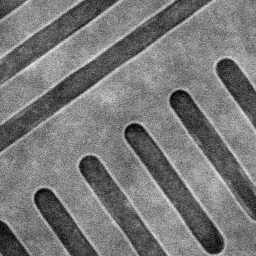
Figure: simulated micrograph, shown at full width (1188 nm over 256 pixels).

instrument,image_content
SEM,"groups of lines, slits or small figures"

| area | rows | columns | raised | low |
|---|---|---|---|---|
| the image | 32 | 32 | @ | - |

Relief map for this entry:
---@@@@@@@----@@@@@@@-----@@@@@@
--@@@@@@-----@@@@@@@-----@@@@@@@
@@@@@@@-----@@@@@@-----@@@@@@@@@
@@@@@-----@@@@@@@-----@@@@@@@@@@
@@@@-----@@@@@@@----@@@@@@@@@@@@
@@-----@@@@@@@-----@@@@@@@@@@@@@
@-----@@@@@@@-----@@@@@@@@@@@@@@
-----@@@@@@-----@@@@@@@@@@@@-@@@
---@@@@@@@-----@@@@@@@@@@@@---@@
--@@@@@@-----@@@@@@@@@@@@@@----@
@@@@@@@-----@@@@@@@@@@@@@@@@---@
@@@@@@-----@@@@@@@@@@@-@@@@@@---
@@@@@----@@@@@@@@@@@@---@@@@@---
@@@-----@@@@@@@@@@@@@----@@@@@--
@@----@@@@@@@@@@@@@@@@----@@@@@-
-----@@@@@@@@@@@--@@@@@---@@@@@-
----@@@@@@@@@@@@---@@@@----@@@@@
--@@@@@@@@@@@@@@---@@@@@----@@@@
-@@@@@@@@@@@@@@@----@@@@@----@@@
@@@@@@@@@@@-@@@@@----@@@@@---@@@
@@@@@@@@@@---@@@@@---@@@@@----@@
@@@@@@@@@@----@@@@@---@@@@@----@
@@@@@@@@@@@---@@@@@----@@@@@---@
@@@@@@@@@@@----@@@@@---@@@@@@---
@@@@---@@@@@----@@@@@---@@@@@---
@@@@----@@@@@----@@@@----@@@@@--
@@@@@----@@@@----@@@@@----@@@@@-
@@@@@@---@@@@@----@@@@@---@@@@@@
-@@@@@----@@@@@----@@@@----@@@@@
--@@@@@----@@@@@---@@@@@----@@@@
---@@@@@---@@@@@----@@@@@---@@@@
---@@@@@----@@@@@----@@@@@--@@@@